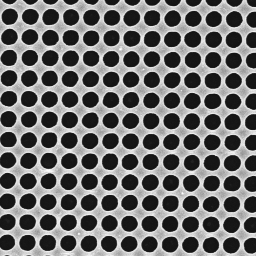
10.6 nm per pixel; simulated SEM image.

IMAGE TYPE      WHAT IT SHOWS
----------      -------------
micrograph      a regular array of holes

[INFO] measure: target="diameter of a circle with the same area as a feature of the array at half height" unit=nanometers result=173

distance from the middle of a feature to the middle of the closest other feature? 213 nm